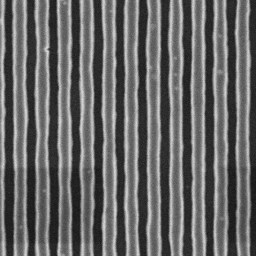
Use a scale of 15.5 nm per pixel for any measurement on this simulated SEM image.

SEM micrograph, parallel lines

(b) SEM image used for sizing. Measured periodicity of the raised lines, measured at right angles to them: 0.345 microns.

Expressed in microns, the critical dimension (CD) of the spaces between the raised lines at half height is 0.151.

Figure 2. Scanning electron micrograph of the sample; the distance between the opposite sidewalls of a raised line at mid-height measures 0.189 um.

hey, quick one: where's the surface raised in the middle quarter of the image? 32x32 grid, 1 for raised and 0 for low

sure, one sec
11001110001110011100011100011100
11001110001110011100011100111100
11001110001110011100011100111100
10001110001110011100011100111000
10001110001110011100011100111000
10001110001110011100011100111000
10001110001110001100011100111000
10001110001110011100011100011000
10000110001110011100011100011000
10000110001110011100011100011000
10000110001110011100011100011100
10000110001110001100011100011000
10001110001110001100011100011000
11001110001110001100011100011000
11001110001110001100011100011000
11001110001110001100011100011000
11001110001110001100011100011000
11001110001110011100011100011000
11001110001110001100011100011000
11001110001110011100011100011000
11001110001110011100011100011000
11000110001110011100011100011000
11000110001110011100011100011000
11001110001110011100011100011000
11001110001110011100011100011000
11001110001110011100011100011000
11001110001110011100011100011000
11001110001110001100011100011000
11001110001110001100011100011000
10001110001110001100011100011000
10001110001110001100011100011000
10001110001110001100011100011000